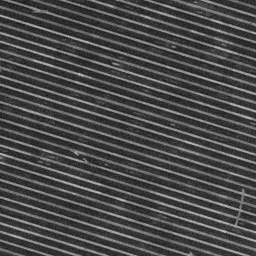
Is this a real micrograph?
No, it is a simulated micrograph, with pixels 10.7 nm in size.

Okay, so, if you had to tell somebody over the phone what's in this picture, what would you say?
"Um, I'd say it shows parallel lines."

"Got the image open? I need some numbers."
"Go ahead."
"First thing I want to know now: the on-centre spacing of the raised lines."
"88.5 nm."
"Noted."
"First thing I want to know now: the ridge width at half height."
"1.79 pixels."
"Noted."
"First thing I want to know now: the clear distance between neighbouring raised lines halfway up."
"6.93 px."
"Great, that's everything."